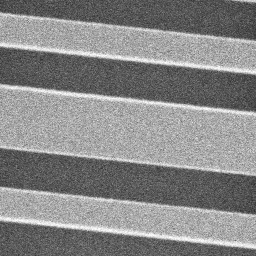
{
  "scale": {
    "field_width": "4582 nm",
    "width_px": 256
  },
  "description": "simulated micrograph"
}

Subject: lines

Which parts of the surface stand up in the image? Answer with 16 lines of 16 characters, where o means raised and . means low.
................
oooooo..........
ooooooooooooooo.
.....ooooooooooo
...............o
oo..............
ooooooooooo.....
oooooooooooooooo
oooooooooooooooo
..oooooooooooooo
...........ooooo
................
ooooooo.........
oooooooooooooooo
......oooooooooo
...............o